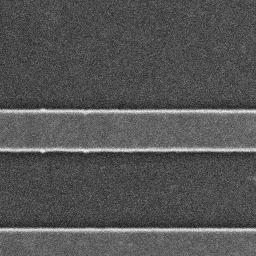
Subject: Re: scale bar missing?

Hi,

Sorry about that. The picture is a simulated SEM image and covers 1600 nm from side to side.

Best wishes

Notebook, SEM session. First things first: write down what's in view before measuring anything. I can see one or a few lines or trenches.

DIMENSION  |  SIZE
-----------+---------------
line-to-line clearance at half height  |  488 nm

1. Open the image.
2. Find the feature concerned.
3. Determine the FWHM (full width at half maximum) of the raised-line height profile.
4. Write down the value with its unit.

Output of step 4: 250 nanometers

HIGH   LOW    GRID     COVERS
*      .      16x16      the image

................
................
................
................
................
................
................
****************
****************
................
................
................
................
................
****************
****************